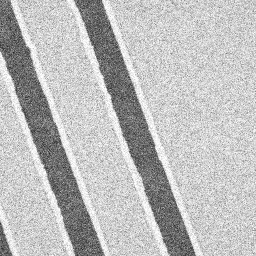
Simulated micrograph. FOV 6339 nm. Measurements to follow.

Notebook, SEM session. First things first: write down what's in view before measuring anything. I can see one or a few lines or trenches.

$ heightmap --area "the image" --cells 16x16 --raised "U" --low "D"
DUUUUDDUUUUUUUUU
DUUUUDDUUUUUUUUU
DDUUUDDDUUUUUUUU
DDUUUUDDUUUUUUUU
DDDUUUDDUUUUUUUU
UDDUUUDDDUUUUUUU
UDDUUUUDDUUUUUUU
UDDDUUUDDUUUUUUU
UUDDUUUDDDUUUUUU
UUDDUUUUDDUUUUUU
UUDDDUUUDDUUUUUU
UUUDDUUUUDDUUUUU
UUUDDUUUUDDUUUUU
UUUUDDUUUDDDUUUU
DUUUDDUUUUDDUUUU
DUUUDDDUUUDDUUUU